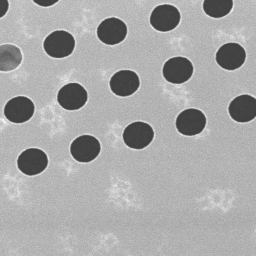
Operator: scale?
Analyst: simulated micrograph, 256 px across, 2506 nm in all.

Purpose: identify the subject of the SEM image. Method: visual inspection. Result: a regular array of holes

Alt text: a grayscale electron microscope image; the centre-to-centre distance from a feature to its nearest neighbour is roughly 525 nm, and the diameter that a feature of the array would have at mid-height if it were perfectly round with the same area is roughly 0.283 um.